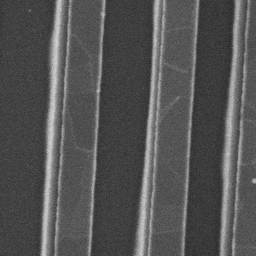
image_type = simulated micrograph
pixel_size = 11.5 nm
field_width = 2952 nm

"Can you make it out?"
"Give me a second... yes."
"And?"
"lines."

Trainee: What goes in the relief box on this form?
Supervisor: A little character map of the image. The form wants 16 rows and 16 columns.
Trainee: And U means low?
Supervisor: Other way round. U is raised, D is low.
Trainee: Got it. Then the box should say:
DDDDUUUDDDUUDDDU
DDDDUUDDDDUUDDDU
DDDDUUDDDDUUDDDU
DDDDUUDDDDUUDDDU
DDDUUUDDDDUUDDDU
DDDUUUDDDDUUDDDU
DDDUUUDDDUUUDDUU
DDDUUUDDDUUUDDUU
DDDUUUDDDUUUDDUU
DDDUUUDDDUUUDDUU
DDDUUUDDDUUUDDUU
DDDUUUDDDUUUDDUU
DDDUUUDDDUUUDDUU
DDDUUUDDDUUUDDUU
DDDUUUDDDUUUDDUU
DDDUUUDDDUUDDDUU